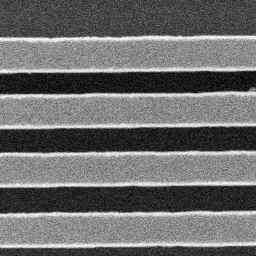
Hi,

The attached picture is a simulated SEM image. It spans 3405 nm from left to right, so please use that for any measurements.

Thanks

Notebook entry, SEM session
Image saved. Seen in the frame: lines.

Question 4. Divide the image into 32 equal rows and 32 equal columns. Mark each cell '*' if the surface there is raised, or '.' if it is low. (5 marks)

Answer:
................................
................................
................................
................................
................................
********************************
********************************
********************************
********************************
................................
................................
...........................*****
********************************
********************************
********************************
********************************
................................
................................
................................
********************************
********************************
********************************
********************************
................................
................................
................................
........................********
********************************
********************************
********************************
********************************
................................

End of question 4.